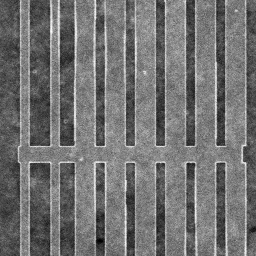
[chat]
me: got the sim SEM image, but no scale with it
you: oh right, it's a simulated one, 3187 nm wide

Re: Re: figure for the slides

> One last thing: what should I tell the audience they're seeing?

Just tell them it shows groups of lines, slits or small figures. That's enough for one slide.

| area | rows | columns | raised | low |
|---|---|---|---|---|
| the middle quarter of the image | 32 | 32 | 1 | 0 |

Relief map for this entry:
00011110001111100011111001111100
00011110001111100011111001111100
00011111001111100011111001111100
00011111001111100011111001111100
00011111001111100011111001111100
00011111001111100011111001111100
00011111001111100011111001111100
00011111001111100011111001111100
00011111001111100011111001111100
00011111001111100011111001111100
00011111001111100011111001111100
00011111001111100011111001111100
00011111001111100011111001111100
00011111001111100011111001111100
00011111001111100011111001111100
00011111001111100011111001111100
00011111001111100011111001111100
00011111001111100011111001111100
00011111001111100011111001111100
00011111001111100011111001111100
00111111001111110011111001111110
11111111111111111111111111111111
11111111111111111111111111111111
11111111111111111111111111111111
11111111111111111111111111111111
00011111001111100011111001111100
00011111001111100011111001111100
00011111001111100011111001111100
00011111001111100011111001111100
00011111001111100011111001111100
00011111001111100011111001111100
00011111001111100011111001111100